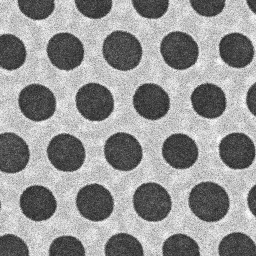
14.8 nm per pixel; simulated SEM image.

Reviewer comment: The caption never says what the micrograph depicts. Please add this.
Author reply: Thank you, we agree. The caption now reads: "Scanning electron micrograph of a regular array of holes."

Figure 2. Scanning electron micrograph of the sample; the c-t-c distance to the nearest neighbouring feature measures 842 nanometres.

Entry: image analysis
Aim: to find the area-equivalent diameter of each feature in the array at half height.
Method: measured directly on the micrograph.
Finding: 38.9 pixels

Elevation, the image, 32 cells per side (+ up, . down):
++.....++.....+++....+++....+++.
+++....+++....+++....+++....++++
++++++++++++++++++++++++++++++++
++++++++++++++++++++++++++++++++
..+++++..++++....++++...++++...+
...+++....+++.....++.....++.....
...+++.....++.....++.....++.....
...+++....+++.....++.....+++...+
..+++++...++++...++++...+++++.++
++++++++++++++++++++++++++++++++
++++.++++++..+++++.++++++..+++++
++.....+++....+++....+++....+++.
++.....++.....+++....+++....+++.
++.....+++....+++....+++....+++.
+++....+++....++++...++++...++++
++++++++++++++++++++++++++++++++
++++++++++++++++++++++++++++++++
...+++....+++....++++...++++...+
....++.....++.....++.....++.....
....++.....++.....++.....++.....
...+++....++++...++++...++++...+
..++++++.+++++++++++++++++++++++
++++++++++++++++++++++++++++++++
+++...++++...++++....+++....+++.
+++....+++....+++....+++.....++.
++.....++.....+++....+++.....++.
+++....+++....+++....+++.....++.
++++..+++++..+++++..+++++...++++
++++++++++++++++++++++++++++++++
..++++++.+++++...++++...++++...+
...+++....+++.....++.....++.....
....++.....++.....++.....++.....